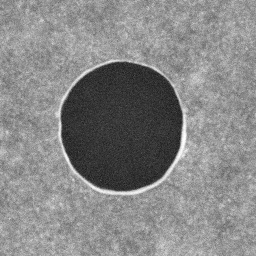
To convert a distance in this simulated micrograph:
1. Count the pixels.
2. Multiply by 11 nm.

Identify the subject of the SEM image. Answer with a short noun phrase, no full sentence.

holes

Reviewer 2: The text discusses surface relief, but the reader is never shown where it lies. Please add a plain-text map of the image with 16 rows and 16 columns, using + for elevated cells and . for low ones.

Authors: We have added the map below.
++++++++++++++++
++++++++++++++++
++++++++++++++++
++++++++++++++++
+++++.....++++++
++++.......+++++
++++.......+++++
++++.......+++++
++++.......+++++
++++.......+++++
+++++......+++++
++++++....++++++
++++++++++++++++
++++++++++++++++
++++++++++++++++
++++++++++++++++